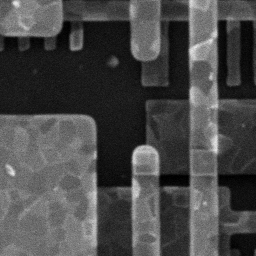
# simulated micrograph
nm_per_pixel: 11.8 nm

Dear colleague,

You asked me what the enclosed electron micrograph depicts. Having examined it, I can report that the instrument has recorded wiring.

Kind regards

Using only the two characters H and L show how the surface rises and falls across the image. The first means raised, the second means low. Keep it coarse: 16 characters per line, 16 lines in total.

HHHHHHHHHHHHHHHH
HHHHLLLLHHLLHHLL
LLLLLLLLHHLLHHLL
LLLLLLLLHHLLHHLL
LLLLLLLLLLLLHHLL
LLLLLLLLLLLLHHLL
LLLLLLLLLLLLHHLL
HHHHHHLLLLLLHHLL
HHHHHHLLLLLLHHLL
HHHHHHLLHHLLHHLL
HHHHHHLLHHLLHHLL
HHHHHHLLHHLLHHLL
HHHHHHHHHHHHHHLL
HHHHHHHHHHHHHHHH
HHHHHHHHHHHHHHHL
HHHHHHHHHHHHHHLL